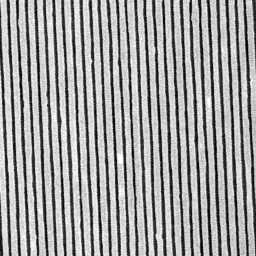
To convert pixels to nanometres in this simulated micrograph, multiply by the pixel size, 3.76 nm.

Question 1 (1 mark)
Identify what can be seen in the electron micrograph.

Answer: parallel lines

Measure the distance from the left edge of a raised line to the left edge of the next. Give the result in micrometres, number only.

0.0342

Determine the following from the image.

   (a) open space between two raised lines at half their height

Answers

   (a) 10.8 nm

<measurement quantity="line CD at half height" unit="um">0.0216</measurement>